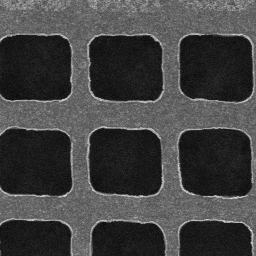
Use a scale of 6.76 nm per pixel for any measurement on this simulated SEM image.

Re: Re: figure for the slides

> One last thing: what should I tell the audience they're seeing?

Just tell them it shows holes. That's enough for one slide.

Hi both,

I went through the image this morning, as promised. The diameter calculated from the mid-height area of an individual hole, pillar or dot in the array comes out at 516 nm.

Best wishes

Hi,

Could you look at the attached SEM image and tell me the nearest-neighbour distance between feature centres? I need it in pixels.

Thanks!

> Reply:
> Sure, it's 90.4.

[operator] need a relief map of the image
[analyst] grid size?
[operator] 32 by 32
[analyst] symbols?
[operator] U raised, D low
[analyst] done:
UUUUUUUUUUUUUUUUUUUUUUUUUUUUUUUU
UUUUUUUUUUUUUUUUUUUUUUUUUUUUUUUU
UUUUUUUUUUUUUUUUUUUUUUUUUUUUUUUU
UUUUUUUUUUUUUUUUUUUUUUUUUUUUUUUU
UUDDDDDDUUUUDDDDDDDUUUUDDDDDUDUU
DDDDDDDDDUUDDDDDDDDDUUDDDDDDDDDU
DDDDDDDDDUUDDDDDDDDDUUDDDDDDDDDD
DDDDDDDDDUUDDDDDDDDDUUDDDDDDDDDD
DDDDDDDDDUUDDDDDDDDDUUDDDDDDDDDD
DDDDDDDDDUUDDDDDDDDDUUDDDDDDDDDD
DDDDDDDDDUUDDDDDDDDDUUDDDDDDDDDD
DDDDDDDDDUUUDDDDDDDDUUUDDDDDDDDD
UDDDDDDUUUUUUDDDDDDUUUUUUUDDDDDU
UUUUUUUUUUUUUUUUUUUUUUUUUUUUUUUU
UUUUUUUUUUUUUUUUUUUUUUUUUUUUUUUU
UUUUUUUUUUUUUUUUUUUUUUUUUUUUUUUU
UDDDDDDDUUUUDDDDDDDUUUUDDDDDDDUU
DDDDDDDDDUUDDDDDDDDDUUDDDDDDDDDU
DDDDDDDDDUUDDDDDDDDDUUDDDDDDDDDU
DDDDDDDDDUUDDDDDDDDDUUDDDDDDDDDU
DDDDDDDDDUUDDDDDDDDDUUDDDDDDDDDU
DDDDDDDDDUUDDDDDDDDDUUUDDDDDDDDU
DDDDDDDDDUUDDDDDDDDDUUUDDDDDDDDU
DDDDDDDDDUUUDDDDDDDDUUUDDDDDDDDU
UUUUUUDDUUUUUUUUUUUUUUUUUDUUDDUU
UUUUUUUUUUUUUUUUUUUUUUUUUUUUUUUU
UUUUUUUUUUUUUUUUUUUUUUUUUUUUUUUU
UDDUUUUUUUUUUUUUUUUUUUUUUUUUUUUU
DDDDDDDDDUUUDDDDDDDDUUUDDDDDDDDU
DDDDDDDDDUUDDDDDDDDDUUDDDDDDDDDU
DDDDDDDDDUUDDDDDDDDDDUDDDDDDDDDU
DDDDDDDDDUUDDDDDDDDDDUDDDDDDDDDD